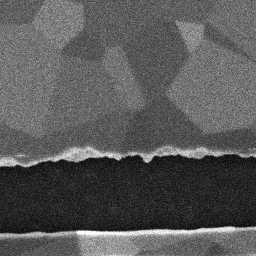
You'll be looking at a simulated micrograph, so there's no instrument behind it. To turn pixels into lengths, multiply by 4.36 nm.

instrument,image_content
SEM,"one or a few lines or trenches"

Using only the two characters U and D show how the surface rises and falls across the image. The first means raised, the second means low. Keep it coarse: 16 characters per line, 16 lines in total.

UUUUUUUUUUUUUUUU
UUUUUUUUUUUUUUUU
UUUUUUUUUUUUUUUU
UUUUUUUUUUUUUUUU
UUUUUUUUUUUUUUUU
UUUUUUUUUUUUUUUU
UUUUUUUUUUUUUUUU
UUUUUUUUUUUUUUUU
UUUUUUUUUUUUUUUU
UUUUUUUUUUUUDUUU
DDDDDDDDDDDDDDDD
DDDDDDDDDDDDDDDD
DDDDDDDDDDDDDDDD
DDDDDDDDDDDDDDDD
DDDDUUDDDUUUUUUU
UUUUUUUUUUUUUUUU